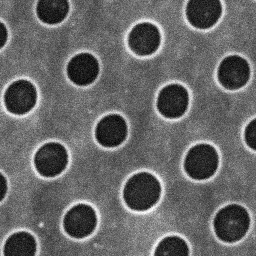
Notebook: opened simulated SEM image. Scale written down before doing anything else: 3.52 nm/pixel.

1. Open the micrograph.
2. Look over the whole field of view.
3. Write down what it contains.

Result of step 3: a regular array of holes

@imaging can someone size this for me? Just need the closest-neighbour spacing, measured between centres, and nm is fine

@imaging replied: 236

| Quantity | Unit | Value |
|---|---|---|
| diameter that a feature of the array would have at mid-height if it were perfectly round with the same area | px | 35.7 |